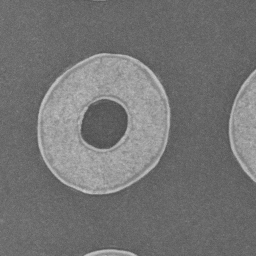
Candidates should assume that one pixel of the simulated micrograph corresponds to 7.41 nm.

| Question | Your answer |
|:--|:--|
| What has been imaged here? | ring-shaped raised bodies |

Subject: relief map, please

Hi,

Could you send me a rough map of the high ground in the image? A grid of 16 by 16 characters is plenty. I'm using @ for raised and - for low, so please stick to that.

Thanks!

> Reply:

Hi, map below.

----------------
----------------
----------------
------@@--------
----@@@@@-------
---@@@@@@@-----@
---@@@-@@@@----@
--@@@---@@@---@@
--@@@---@@----@@
---@@@@@@@-----@
---@@@@@@------@
----@@@@--------
----------------
----------------
----------------
----------------